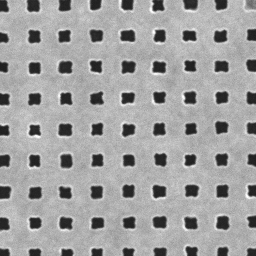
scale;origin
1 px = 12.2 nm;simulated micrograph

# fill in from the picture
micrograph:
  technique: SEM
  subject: a regular array of holes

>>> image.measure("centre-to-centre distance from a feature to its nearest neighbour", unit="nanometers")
372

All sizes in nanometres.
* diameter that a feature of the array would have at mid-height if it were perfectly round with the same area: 164